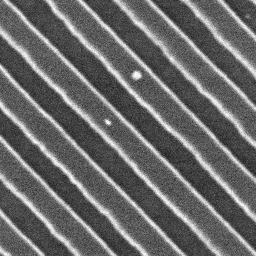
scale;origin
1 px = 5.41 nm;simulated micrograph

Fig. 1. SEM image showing lines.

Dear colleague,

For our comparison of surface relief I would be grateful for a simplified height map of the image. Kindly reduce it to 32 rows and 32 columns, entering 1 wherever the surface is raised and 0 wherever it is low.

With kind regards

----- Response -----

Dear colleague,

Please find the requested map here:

10000011111000011110000011110000
11000001111100001111000001111000
11100000111110000111100001111100
11110000011111000011110000111110
01111000001111000001111000011111
00111100000111100000111100001111
00011110000011111000011110000111
00001111000001111000001111000011
00001111100000111100000111100001
10000111110000011110000111110000
11000011111000011111000011111000
11100001111100001111100001111100
11110000111110000111110000011110
11111000011111000011111000001111
01111100001111100001111100000111
00111110000111110000111110000011
00011111000011111000011111000011
00001111100001111100000111100001
10000111110000011110000011110000
11000011111000011111000001111000
11100001111100001111100001111100
11110000111110000111110000111110
11111000011111000011111000011111
01111100001111100001111100001111
00111110000111110000111110000111
00011111000011111000011111000011
00001111100001111100001111100001
10000111110000111110000111110000
11000011111000011111000011111000
11100001111100001111100001111100
11110000111110000111110000111110
11111000011111000011111000011111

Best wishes